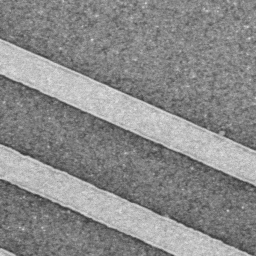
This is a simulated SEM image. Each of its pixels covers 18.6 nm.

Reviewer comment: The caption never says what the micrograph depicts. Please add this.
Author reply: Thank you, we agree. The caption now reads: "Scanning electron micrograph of one or a few lines or trenches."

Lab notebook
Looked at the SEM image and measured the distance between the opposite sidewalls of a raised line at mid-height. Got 0.56 µm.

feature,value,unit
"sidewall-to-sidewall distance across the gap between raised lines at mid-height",1240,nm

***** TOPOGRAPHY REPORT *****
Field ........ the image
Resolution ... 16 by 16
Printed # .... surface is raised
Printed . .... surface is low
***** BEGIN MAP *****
................
................
................
##..............
#####...........
..#####.........
....#####.......
.......####.....
.........#####..
#..........#####
###...........##
.####...........
...#####........
......####......
........####....
..........#####.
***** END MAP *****